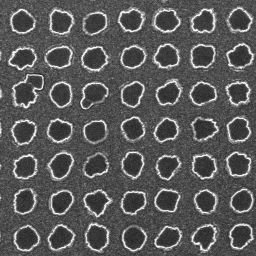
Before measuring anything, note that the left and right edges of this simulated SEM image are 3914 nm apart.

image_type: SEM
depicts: a regular array of raised bodies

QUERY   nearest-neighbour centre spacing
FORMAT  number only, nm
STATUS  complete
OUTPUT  525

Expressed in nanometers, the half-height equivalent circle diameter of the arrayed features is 352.